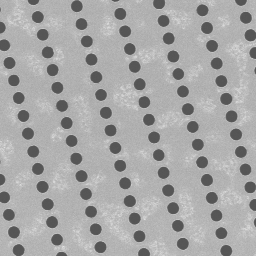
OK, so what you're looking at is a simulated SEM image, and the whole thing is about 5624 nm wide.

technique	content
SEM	a regular array of holes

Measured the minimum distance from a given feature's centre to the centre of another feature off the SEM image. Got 402 nm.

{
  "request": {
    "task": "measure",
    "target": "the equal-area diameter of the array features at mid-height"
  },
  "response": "0.262 µm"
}